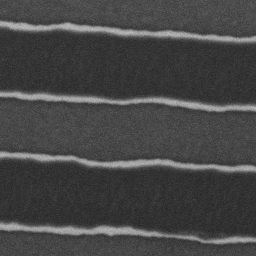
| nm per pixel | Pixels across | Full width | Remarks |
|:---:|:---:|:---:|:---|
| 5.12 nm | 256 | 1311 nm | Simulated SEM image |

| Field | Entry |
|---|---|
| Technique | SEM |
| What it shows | one or a few lines or trenches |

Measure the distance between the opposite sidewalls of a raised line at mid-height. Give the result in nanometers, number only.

369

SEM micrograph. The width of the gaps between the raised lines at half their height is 306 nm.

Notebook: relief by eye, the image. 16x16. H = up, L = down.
LLLLLLLLLLLLLLLL
HLLLLLLLLLLLLLLL
HHHHHHHHHHHHHHHH
HHHHHHHHHHHHHHHH
HHHHHHHHHHHHHHHH
HHHHHHHHHHHHHHHH
LLLLLLLLLLLHHHHH
LLLLLLLLLLLLLLLL
LLLLLLLLLLLLLLLL
LLLLLLLLLLLLLLLL
HHHHHHHHHHHHHHHH
HHHHHHHHHHHHHHHH
HHHHHHHHHHHHHHHH
HHHHHHHHHHHHHHHH
LLLLLLLLHHHHHHHH
LLLLLLLLLLLLLLLL